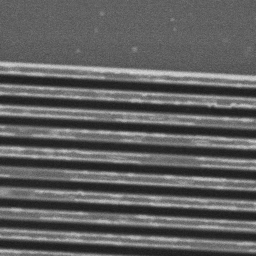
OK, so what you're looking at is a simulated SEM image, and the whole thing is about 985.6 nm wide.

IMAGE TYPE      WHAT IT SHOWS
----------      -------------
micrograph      parallel lines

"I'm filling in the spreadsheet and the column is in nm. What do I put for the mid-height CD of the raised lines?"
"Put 41.8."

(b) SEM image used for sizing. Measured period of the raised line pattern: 0.0791 µm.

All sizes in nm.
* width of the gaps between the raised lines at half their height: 38.4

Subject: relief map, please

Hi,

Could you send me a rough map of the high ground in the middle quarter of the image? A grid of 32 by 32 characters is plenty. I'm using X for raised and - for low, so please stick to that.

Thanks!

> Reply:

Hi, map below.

--------------------------------
XXXXXXXXXXXXXX------------------
XXXXXXXXXXXXXXXXXXXXXXXXXXXXX---
-----XXXXXXXXXXXXXXXXXXXXXXXXXXX
-----------------------XXXXXXXXX
--------------------------------
XXXXXXXXXX----------------------
XXXXXXXXXXXXXXXXXXXXXXXXXXXX----
XXXXXXXXXXXXXXXXXXXXXXXXXXXXXXXX
-------------------XXXXXXXXXXXXX
--------------------------------
XXXXX---------------------------
XXXXXXXXXXXXXXXXXXXXXXXXXXX-----
XXXXXXXXXXXXXXXXXXXXXXXXXXXXXXXX
------------------XXXXXXXXXXXXXX
--------------------------------
XXXX----------------------------
XXXXXXXXXXXXXXXXXXXXXXX---------
XXXXXXXXXXXXXXXXXXXXXXXXXXXXXXXX
-------------XXXXXXXXXXXXXXXXXXX
-------------------------------X
-XXX----------------------------
XXXXXXXXXXXXXXXXXXXXXX----------
XXXXXXXXXXXXXXXXXXXXXXXXXXXXXXXX
------------XXXXXXXXXXXXXXXXXXXX
-------------------------------X
--------------------------------
XXXXXXXXXXXXXXXXX---------------
XXXXXXXXXXXXXXXXXXXXXXXXXXXXXXXX
--------XXXXXXXXXXXXXXXXXXXXXXXX
--------------------------XXXXXX
--------------------------------